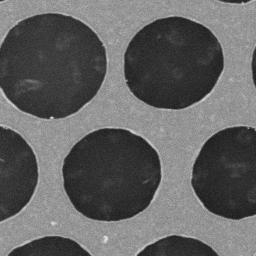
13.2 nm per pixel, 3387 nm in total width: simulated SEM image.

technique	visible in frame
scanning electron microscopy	holes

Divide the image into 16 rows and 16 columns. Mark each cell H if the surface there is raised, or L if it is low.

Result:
HHHHHHHHHHHHHHHH
HLLLLHHHHLLLLHHH
LLLLLLHHLLLLLLHH
LLLLLLLHLLLLLLHH
LLLLLLLHLLLLLLHH
LLLLLLHHLLLLLHHH
HLLLLHHHHLLLHHHH
HHHHHHHHHHHHHHHH
LHHHHLLLLHHHHLLL
LLHHLLLLLLHHLLLL
LLHHLLLLLLHHLLLL
LLHHLLLLLLHHLLLL
LLHHLLLLLLHHLLLL
LHHHHLLLHHHHHHLL
HHHHHHHHHHHHHHHH
HLLLLHHHHLLLLHHH